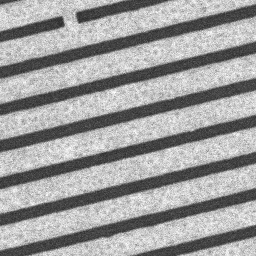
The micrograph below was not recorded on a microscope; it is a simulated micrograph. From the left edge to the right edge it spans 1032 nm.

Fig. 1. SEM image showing parallel lines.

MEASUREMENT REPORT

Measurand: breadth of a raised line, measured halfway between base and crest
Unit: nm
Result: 91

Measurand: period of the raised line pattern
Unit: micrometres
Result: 0.144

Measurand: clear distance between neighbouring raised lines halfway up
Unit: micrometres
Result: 0.0493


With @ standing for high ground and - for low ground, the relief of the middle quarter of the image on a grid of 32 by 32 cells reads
@@@@@@@@@@@@@@@@@@@@@@----------
@@@@@@@@@@@@@@@@@@--------------
@@@@@@@@@@@@@@-------------@@@@@
@@@@@@@@@@--------------@@@@@@@@
@@@@@@-------------@@@@@@@@@@@@@
@@@------------@@@@@@@@@@@@@@@@@
------------@@@@@@@@@@@@@@@@@@@@
-------@@@@@@@@@@@@@@@@@@@@@@@@-
---@@@@@@@@@@@@@@@@@@@@@@@@-----
@@@@@@@@@@@@@@@@@@@@@@@---------
@@@@@@@@@@@@@@@@@@@-------------
@@@@@@@@@@@@@@@--------------@@@
@@@@@@@@@@--------------@@@@@@@@
@@@@@@---------------@@@@@@@@@@@
@@--------------@@@@@@@@@@@@@@@@
------------@@@@@@@@@@@@@@@@@@@@
--------@@@@@@@@@@@@@@@@@@@@@@@@
----@@@@@@@@@@@@@@@@@@@@@@@@----
@@@@@@@@@@@@@@@@@@@@@@@---------
@@@@@@@@@@@@@@@@@@@-------------
@@@@@@@@@@@@@@@-------------@@@@
@@@@@@@@@@@--------------@@@@@@@
@@@@@@@--------------@@@@@@@@@@@
@@@-------------@@@@@@@@@@@@@@@@
-------------@@@@@@@@@@@@@@@@@@@
--------@@@@@@@@@@@@@@@@@@@@@@@@
----@@@@@@@@@@@@@@@@@@@@@@@@@---
-@@@@@@@@@@@@@@@@@@@@@@@--------
@@@@@@@@@@@@@@@@@@@@------------
@@@@@@@@@@@@@@@@--------------@@
@@@@@@@@@@@@--------------@@@@@@
@@@@@@@@--------------@@@@@@@@@@